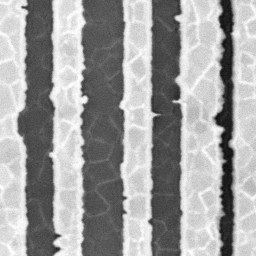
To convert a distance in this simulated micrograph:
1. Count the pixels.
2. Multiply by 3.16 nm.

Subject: one or a few lines or trenches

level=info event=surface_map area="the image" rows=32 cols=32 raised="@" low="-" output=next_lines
@@@----@@@------@@@----@@@@--@@@
@@@----@@@------@@@----@@@@@-@@@
@@@----@@@------@@@---@@@@@--@@@
@@@----@@@------@@@----@@@@@-@@@
@@@----@@@------@@@----@@@@@-@@@
@@@----@@@------@@@----@@@@--@@@
@@@----@@@------@@@----@@@@--@@@
@@@----@@@------@@@----@@@@--@@@
@@@----@@@------@@@----@@@@--@@@
@@@----@@@------@@@----@@@@--@@@
@@@----@@@------@@@---@@@@@--@@@
@@@----@@@------@@@----@@@@@-@@@
@@@----@@@@----@@@@----@@@@--@@@
@@@----@@@-----@@@@----@@@@--@@@
@@-----@@@------@@@----@@@@--@@@
@@-----@@@------@@@----@@@@--@@@
@@-----@@@------@@@----@@@@@-@@@
@@@----@@@------@@@----@@@@--@@@
@@@----@@@------@@@----@@@@--@@@
@@@----@@@------@@@----@@@@--@@@
@@@----@@@------@@@----@@@@@-@@@
@@@----@@@-----@@@@----@@@@@-@@@
@@@----@@@------@@@----@@@@@-@@@
@@@----@@@------@@@----@@@@--@@@
@@@----@@@------@@@----@@@@@-@@@
@@@----@@@------@@@----@@@@@-@@@
@@@----@@@------@@@----@@@@--@@@
@@@----@@@------@@@----@@@@--@@@
@@@----@@@------@@@----@@@@--@@@
@@@----@@@------@@@----@@@@--@@@
@@@----@@@------@@@----@@@@--@@@
@@@----@@@------@@@----@@@@--@@@